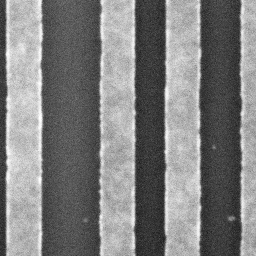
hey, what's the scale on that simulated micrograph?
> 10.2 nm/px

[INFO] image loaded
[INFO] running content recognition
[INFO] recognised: lines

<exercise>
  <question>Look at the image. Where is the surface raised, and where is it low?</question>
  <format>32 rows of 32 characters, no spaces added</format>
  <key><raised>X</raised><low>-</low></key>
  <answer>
-XXXX--------XXXX----XXXX-----XX
-XXXX--------XXXX----XXXX-----XX
-XXXX--------XXXX----XXXX-----XX
-XXXX--------XXXX----XXXX-----XX
-XXXX--------XXXX----XXXX-----XX
-XXXX--------XXXX----XXXX-----XX
-XXXX--------XXXX----XXXX-----XX
-XXXX--------XXXX----XXXX-----XX
-XXXX--------XXXX----XXXX-----XX
-XXXX--------XXXX----XXXX-----XX
-XXXX--------XXXX----XXXX-----XX
-XXXX--------XXXX----XXXX-----XX
-XXXX--------XXXX----XXXX-----XX
-XXXX--------XXXX----XXXX-----XX
-XXXX--------XXXX----XXXX-----XX
-XXXX--------XXXX----XXXX-----XX
-XXXX--------XXXX----XXXX-----XX
-XXXX--------XXXX----XXXX-----XX
-XXXX--------XXXX----XXXX-----XX
-XXXX--------XXXX----XXXX-----XX
-XXXX--------XXXX----XXXX-----XX
-XXXX--------XXXX----XXXX-----XX
-XXXX--------XXXX----XXXX-----XX
-XXXX--------XXXX----XXXX-----XX
-XXXX--------XXXX----XXXX-----XX
-XXXX--------XXXX----XXXX-----XX
-XXXX--------XXXX----XXXX-----XX
-XXXX--------XXXX----XXXX-----XX
-XXXX--------XXXX----XXXX-----XX
-XXXX--------XXXX----XXXX-----XX
-XXXX--------XXXX----XXXX-----XX
-XXXX--------XXXX----XXXX-----XX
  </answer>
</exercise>